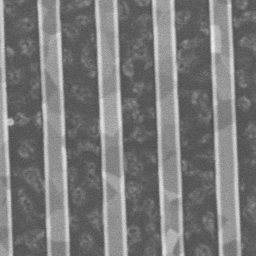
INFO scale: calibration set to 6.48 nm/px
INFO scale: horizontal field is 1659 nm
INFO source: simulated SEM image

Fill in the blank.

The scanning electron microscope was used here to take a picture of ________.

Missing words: parallel lines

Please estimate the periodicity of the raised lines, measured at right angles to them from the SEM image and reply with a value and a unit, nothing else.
369 nm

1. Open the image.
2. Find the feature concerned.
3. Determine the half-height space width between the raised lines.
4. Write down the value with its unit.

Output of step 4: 253 nm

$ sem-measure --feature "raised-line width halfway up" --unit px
18.6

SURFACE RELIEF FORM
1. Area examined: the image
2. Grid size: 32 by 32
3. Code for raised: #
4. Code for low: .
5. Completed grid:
.....##.....##.....###....###...
.....##.....##.....###....###...
.....##.....###....###.....##...
.....##.....###....###.....##...
.....##.....###....###.....##...
.....##.....###.....##.....##...
.....##.....###.....##.....##...
.....###....###.....##.....##...
.....###....###.....##.....##...
.....###....###.....##.....##...
#....###....###.....##.....##...
#....###.....##.....##.....##...
#....###.....##.....##.....##...
#.....##.....##.....##.....##...
#.....##.....##.....##.....##...
#.....##.....##.....##.....##...
#.....##.....##.....##.....##...
#.....##.....##.....##.....##...
#.....##.....##.....##.....##...
#.....##.....##.....##.....##...
#.....##.....##.....##.....##...
#.....##.....##.....##.....##...
#.....##.....##.....##.....###..
#.....##.....##.....##.....###..
#.....##.....##.....###....###..
#.....##.....##.....###....###..
#.....##.....##.....###....###..
#.....##.....###....###....###..
#.....##.....###....###.....##..
#.....##.....###....###.....##..
#.....##.....###....###.....##..
#.....##.....###....###.....##..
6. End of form